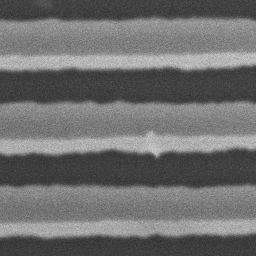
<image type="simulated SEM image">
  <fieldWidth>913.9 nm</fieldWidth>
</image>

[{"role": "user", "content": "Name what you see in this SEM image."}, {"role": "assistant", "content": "lines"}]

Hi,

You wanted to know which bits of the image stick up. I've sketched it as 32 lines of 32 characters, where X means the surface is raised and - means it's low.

--------------------------------
--------------------------------
------X-----------------------X-
XXXXXXXXXXXXXXXXXXXXXXXXXXXXXXXX
XXXXXXXXXXXXXXXXXXXXXXXXXXXXXXXX
XXXXXXXXXXXXXXXXXXXXXXXXXXXXXXXX
XXXXXXXXXXXXXXXXXXXXXXXXXXXXXXXX
XXXXXXXXXXXXXXXXXXXXXXXXXXXXXXXX
XXXXXXXX--XXXXXXXX----XXXX------
--------------------------------
--------------------------------
--------------------------------
--------------------------------
XXXXXXXXXXXXXXXXXXXXXXXXXXXXXXXX
XXXXXXXXXXXXXXXXXXXXXXXXXXXXXXXX
XXXXXXXXXXXXXXXXXXXXXXXXXXXXXXXX
XXXXXXXXXXXXXXXXXXXXXXXXXXXXXXXX
XXXXXXXXXXXXXXXXXXXXXXXXXXXXXXXX
XXXXXXXXXXXXXXXXXXXXXXXXXXXXX--X
--------------------------------
--------------------------------
--------------------------------
--------------------------------
XX-XXXXXX-XXX----X--X-X----XXXXX
XXXXXXXXXXXXXXXXXXXXXXXXXXXXXXXX
XXXXXXXXXXXXXXXXXXXXXXXXXXXXXXXX
XXXXXXXXXXXXXXXXXXXXXXXXXXXXXXXX
XXXXXXXXXXXXXXXXXXXXXXXXXXXXXXXX
XXXXXXXXXXXXXXXXXXXXXXXXXXXXXXXX
X----XX-X--------X--------------
--------------------------------
--------------------------------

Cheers